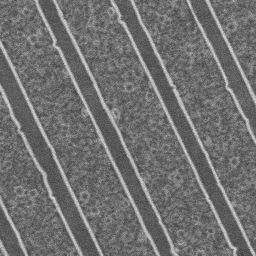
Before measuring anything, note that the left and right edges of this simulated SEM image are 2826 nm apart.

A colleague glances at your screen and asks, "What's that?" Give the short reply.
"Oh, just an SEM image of one or a few lines or trenches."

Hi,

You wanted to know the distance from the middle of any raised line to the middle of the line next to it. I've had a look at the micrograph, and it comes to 758 nm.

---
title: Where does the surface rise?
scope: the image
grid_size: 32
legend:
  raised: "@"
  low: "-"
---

@@@@@--@@@@@@@---@@@@@@@--@@@@@@
@@@@@--@@@@@@@@--@@@@@@@---@@@@@
@@@@@@--@@@@@@@---@@@@@@@--@@@@@
@@@@@@--@@@@@@@@--@@@@@@@---@@@@
@@@@@@@--@@@@@@@---@@@@@@@--@@@@
@@@@@@@--@@@@@@@@--@@@@@@@---@@@
-@@@@@@@--@@@@@@@---@@@@@@@--@@@
-@@@@@@@--@@@@@@@@--@@@@@@@---@@
--@@@@@@---@@@@@@@---@@@@@@@--@@
--@@@@@@@--@@@@@@@@--@@@@@@@--@@
---@@@@@@---@@@@@@@--@@@@@@@---@
---@@@@@@@--@@@@@@@@--@@@@@@@--@
@--@@@@@@@---@@@@@@@--@@@@@@@---
@---@@@@@@@--@@@@@@@@--@@@@@@@--
@@--@@@@@@@---@@@@@@@--@@@@@@@--
@@---@@@@@@@--@@@@@@@@--@@@@@@@-
@@@--@@@@@@@---@@@@@@@--@@@@@@@-
@@@---@@@@@@@--@@@@@@@---@@@@@@@
@@@@--@@@@@@@---@@@@@@@--@@@@@@@
@@@@---@@@@@@@--@@@@@@@---@@@@@@
@@@@@--@@@@@@@---@@@@@@@--@@@@@@
@@@@@---@@@@@@@--@@@@@@@---@@@@@
@@@@@@--@@@@@@@---@@@@@@@--@@@@@
@@@@@@---@@@@@@@--@@@@@@@---@@@@
@@@@@@---@@@@@@@---@@@@@@@--@@@@
@@@@@@@---@@@@@@@--@@@@@@@---@@@
-@@@@@@---@@@@@@@---@@@@@@@--@@@
-@@@@@@@---@@@@@@@--@@@@@@@---@@
--@@@@@@---@@@@@@@---@@@@@@@--@@
--@@@@@@@---@@@@@@@--@@@@@@@---@
---@@@@@@---@@@@@@@--@@@@@@@@--@
@--@@@@@@@---@@@@@@@--@@@@@@@---